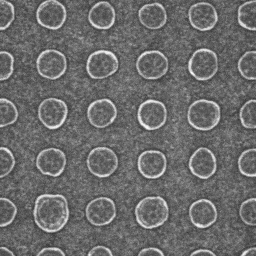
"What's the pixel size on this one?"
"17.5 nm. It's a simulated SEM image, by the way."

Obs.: a regular array of raised bodies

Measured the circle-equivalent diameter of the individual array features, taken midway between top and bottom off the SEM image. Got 28.4 pixels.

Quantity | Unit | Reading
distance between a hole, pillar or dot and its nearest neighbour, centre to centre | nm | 848